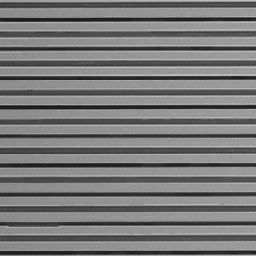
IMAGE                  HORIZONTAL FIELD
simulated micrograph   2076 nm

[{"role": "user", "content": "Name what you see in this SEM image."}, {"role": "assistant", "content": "parallel lines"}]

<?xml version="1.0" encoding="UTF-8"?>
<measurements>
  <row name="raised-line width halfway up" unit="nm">74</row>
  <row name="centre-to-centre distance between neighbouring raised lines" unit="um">0.118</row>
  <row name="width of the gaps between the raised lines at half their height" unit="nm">40.6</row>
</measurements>